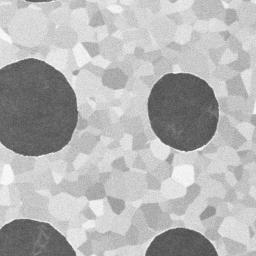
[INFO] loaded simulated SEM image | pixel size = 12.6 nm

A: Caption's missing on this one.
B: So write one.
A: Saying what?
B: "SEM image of holes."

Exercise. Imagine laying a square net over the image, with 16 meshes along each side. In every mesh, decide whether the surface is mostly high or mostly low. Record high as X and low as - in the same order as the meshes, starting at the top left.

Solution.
XXXXXXXXXXXXXXXX
XXXXXXXXXXXXXXXX
XXXXXXXXXXXXXXXX
XXXXXXXXXXXXXXXX
----XXXXXXXXXXXX
-----XXXXX---XXX
-----XXXX-----XX
-----XXXX-----XX
-----XXXXX---XXX
X---XXXXXXXXXXXX
XXXXXXXXXXXXXXXX
XXXXXXXXXXXXXXXX
XXXXXXXXXXXXXXXX
XXXXXXXXXXXXXXXX
----XXXXXX--XXXX
-----XXXX----XXX